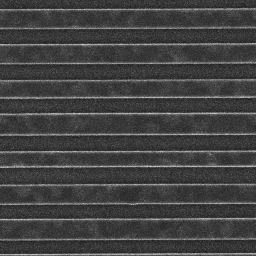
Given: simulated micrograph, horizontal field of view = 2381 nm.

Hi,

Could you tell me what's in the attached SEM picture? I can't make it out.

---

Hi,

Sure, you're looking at parallel lines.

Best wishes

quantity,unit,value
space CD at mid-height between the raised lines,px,16.1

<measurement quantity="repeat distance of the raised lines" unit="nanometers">326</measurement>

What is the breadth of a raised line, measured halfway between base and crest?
174 nm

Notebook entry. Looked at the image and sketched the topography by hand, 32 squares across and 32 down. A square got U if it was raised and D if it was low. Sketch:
DDDDDDDDDDDDDDDDDDDDDDDDDDDDDDDD
UUUUUUUUUUUUUUUUUUUUUUUUUUUUUUUU
UUUUUUUUUUUUUUUUUUUUUUUUUUUUUUUU
UUUUUUUUUUDDDDDDDDDDDDDDDDDDDDDD
DDDDDDDDDDDDDDDDDDDDDDDDDDDDDDDD
DDDDDDDDDDDDDDDDDDDDDDDDDDDDDDDD
UUUUUUUUUUUUUUUUUUUUUUUUUUUUUUUU
UUUUUUUUUUUUUUUUUUUUUUUUUUUUUUUU
DDDDDDDDDDDDDDDDDDDDDDDDDDDDDDDD
DDDDDDDDDDDDDDDDDDDDDDDDDDDDDDDD
UUUUUUUUUUUUUUUUUUUUUUUUUUUUUUUU
UUUUUUUUUUUUUUUUUUUUUUUUUUUUUUUU
DDDDDDDDDDDDDDDDDDDDDDDDDDDDDDDD
DDDDDDDDDDDDDDDDDDDDDDDDDDDDDDDD
UUUUUUUUUUUUUUUUUUUUUUUUUUUUUUUU
UUUUUUUUUUUUUUUUUUUUUUUUUUUUUUUU
UUUUUUUUUUUUUUUUUUUUUUUUUUUUUUUU
DDDDDDDDDDDDDDDDDDDDDDDDDDDDDDDD
DDDDDDDDDDDDDDDDDDDDDDDDDDDDDDDD
UUUUUUUUUUUUUUUUUUUUUUUUUUUUUUUU
UUUUUUUUUUUUUUUUUUUUUUUUUUUUUUUU
DDDDDDDDDDDDDDDDDDDDDDDDDDDDDDDD
DDDDDDDDDDDDDDDDDDDDDDDDDDDDDDDD
UUUUUUUUUUUUUUUUUUUUUUUUUUUUUUUU
UUUUUUUUUUUUUUUUUUUUUUUUUUUUUUUU
UUUUUUUDDUUDDDDDDDDDDDDDDDDDDDDD
DDDDDDDDDDDDDDDDDDDDDDDDDDDDDDDD
UUUUUUUUUUUUUUUUUUUUUUUUUUUUUUUU
UUUUUUUUUUUUUUUUUUUUUUUUUUUUUUUU
UUUUUUUUUUUUUUUUUUUUUUUUUUUUUUUU
DDDDDDDDDDDDDDDDDDDDDDDDDDDDDDDD
DDDDDDDDDDDDDDDDDDDDDDDDDDDDDDDD